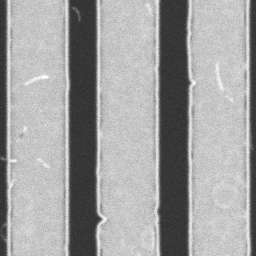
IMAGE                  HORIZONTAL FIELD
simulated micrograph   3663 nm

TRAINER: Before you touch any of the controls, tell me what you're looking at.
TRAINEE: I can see one or a few lines or trenches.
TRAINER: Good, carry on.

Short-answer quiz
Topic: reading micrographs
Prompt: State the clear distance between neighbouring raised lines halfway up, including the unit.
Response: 0.814 um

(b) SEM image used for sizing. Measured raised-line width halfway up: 0.479 µm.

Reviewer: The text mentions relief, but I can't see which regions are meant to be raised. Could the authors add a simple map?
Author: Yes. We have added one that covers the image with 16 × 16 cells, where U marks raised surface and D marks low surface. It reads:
UDDDUUDDDDUUDDDU
UDDDUUDDDDUUDDDU
UDDDUUDDDDUUDDDU
UDDDUUDDDDUUDDDD
UDDDUUDDDDUUDDDD
UDDDUUDDDDUUDDDD
UDDDUUDDDDUUDDDD
UDDDUUDDDDUUDDDU
UDDDUUDDDDUUDDDU
UDDDUUDDDDUUDDDU
UDDDUUDDDDUUDDDU
UDDDUUDDDDUUDDDD
UDDDUUDDDDUUDDDD
UDDDUUDDDDUUDDDD
UDDDUUDDDDUUDDDD
UDDDUUDDDDUUDDDD